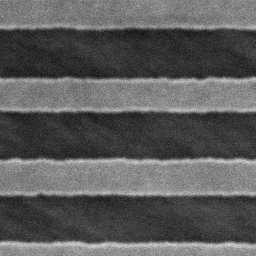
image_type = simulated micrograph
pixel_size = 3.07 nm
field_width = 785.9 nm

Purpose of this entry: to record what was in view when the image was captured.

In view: lines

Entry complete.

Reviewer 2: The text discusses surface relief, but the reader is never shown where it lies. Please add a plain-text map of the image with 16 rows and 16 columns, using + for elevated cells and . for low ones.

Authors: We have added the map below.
++++++++++++++++
++++++++++++++++
................
................
................
++++++++++++++++
++++++++++++++++
................
................
................
++++++++++++++++
++++++++++++++++
................
................
................
++++++++++++++++